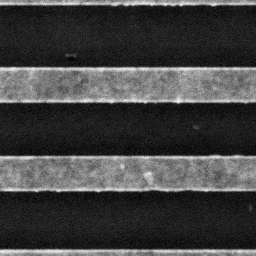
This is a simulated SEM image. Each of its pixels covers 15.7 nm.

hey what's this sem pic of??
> lines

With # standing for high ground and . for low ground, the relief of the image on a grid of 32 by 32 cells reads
###############.#########.######
................................
................................
................................
................................
................................
................................
................................
................................
################################
################################
################################
################################
................................
................................
................................
................................
................................
................................
................................
################################
################################
################################
################################
................................
................................
................................
................................
................................
................................
................................
################################